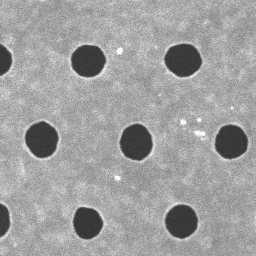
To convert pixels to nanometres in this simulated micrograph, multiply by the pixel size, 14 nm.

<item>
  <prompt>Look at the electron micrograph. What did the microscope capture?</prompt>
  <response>holes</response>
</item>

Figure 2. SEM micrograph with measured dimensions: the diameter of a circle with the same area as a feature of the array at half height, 480 nm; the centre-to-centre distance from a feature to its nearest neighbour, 1280 nm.